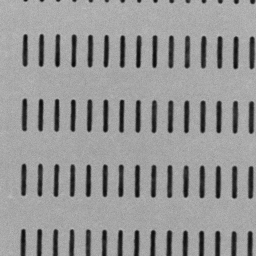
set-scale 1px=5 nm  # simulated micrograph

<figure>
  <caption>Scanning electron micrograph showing a regular array of holes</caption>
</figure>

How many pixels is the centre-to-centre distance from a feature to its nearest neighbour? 16.1